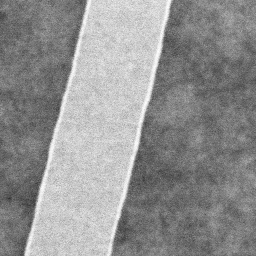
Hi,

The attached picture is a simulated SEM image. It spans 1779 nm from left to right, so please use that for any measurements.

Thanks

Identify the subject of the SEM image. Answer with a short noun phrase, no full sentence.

one or a few lines or trenches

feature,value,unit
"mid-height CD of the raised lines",79.5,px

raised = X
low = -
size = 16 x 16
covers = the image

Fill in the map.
------XXXX------
-----XXXXX------
-----XXXXX------
-----XXXXX------
-----XXXXX------
----XXXXX-------
----XXXXX-------
----XXXXX-------
---XXXXXX-------
---XXXXX--------
---XXXXX--------
---XXXXX--------
--XXXXXX--------
--XXXXX---------
--XXXXX---------
--XXXXX---------